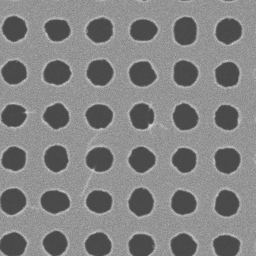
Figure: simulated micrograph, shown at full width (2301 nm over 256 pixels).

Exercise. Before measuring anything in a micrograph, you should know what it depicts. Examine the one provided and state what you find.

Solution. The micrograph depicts a regular array of holes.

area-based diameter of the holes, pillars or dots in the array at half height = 0.228 µm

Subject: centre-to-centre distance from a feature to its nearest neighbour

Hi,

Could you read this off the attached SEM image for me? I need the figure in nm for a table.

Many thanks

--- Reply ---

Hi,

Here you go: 380